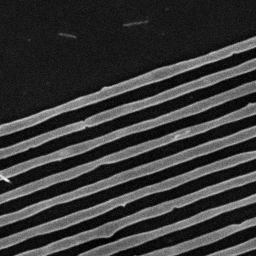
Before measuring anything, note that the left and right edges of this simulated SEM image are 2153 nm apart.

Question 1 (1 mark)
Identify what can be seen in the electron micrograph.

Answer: parallel lines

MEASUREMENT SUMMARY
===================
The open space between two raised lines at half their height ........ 107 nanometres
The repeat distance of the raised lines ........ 179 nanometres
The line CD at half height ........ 74.4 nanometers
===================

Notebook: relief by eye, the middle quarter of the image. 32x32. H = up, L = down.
LLLLLLLLLLLLLLLLLLLLLLLLLLHHHHHH
LLLLLLLLLLLLLLLLLLLLLLLHHHHHHHHL
LLLLLLLLLLLLLLLLLLLLHHHHHHHHLLLL
LLLLLLLLLLLLLLLLLLHHHHHHHHLLLLLL
LLLLLLLLLLLLLLLHHHHHHHLLLLLLLLLL
LLLLLLLLLLLLHHHHHHHLLLLLLLLLLHHH
LLLLLLLLLHHHHHHHHLLLLLLLLLHHHHHH
LLLLLLHHHHHHHHLLLLLLLLLLHHHHHHLL
LLLLHHHHHHHLLLLLLLLLLHHHHHHLLLLL
LLHHHHHHLLLLLLLLLLHHHHHHLLLLLLLL
HHHHHLLLLLLLLLHHHHHHHHLLLLLLLLLH
HHLLLLLLLLLHHHHHHHHLLLLLLLLLHHHH
LLLLLLLLLHHHHHHLLLLLLLLLLLHHHHHH
LLLLLLHHHHHHHLLLLLLLLLLHHHHHHLLL
LLLLHHHHHLLLLLLLLLLLHHHHHHLLLLLL
LHHHHHHLLLLLLLLLHHHHHHHHLLLLLLLL
HHHHLLLLLLLLLHHHHHHHLLLLLLLLLHHH
HLLLLLLLLLLHHHHHLLLLLLLLLLLHHHHH
LLLLLLLLHHHHHHLLLLLLLLLLHHHHHHLL
LLLLLHHHHHHLLLLLLLLLHHHHHHHLLLLL
LHHHHHHHHLLLLLLLLLHHHHHHLLLLLLLL
HHHHHHLLLLLLLLLHHHHHHLLLLLLLLLLH
HHHHLLLLLLLLHHHHHHHLLLLLLLLLHHHH
LLLLLLLLLLHHHHHHLLLLLLLLLHHHHHHH
LLLLLLLHHHHHHLLLLLLLLLHHHHHHHHLL
LLLHHHHHHLLLLLLLLLLHHHHHHHHLLLLL
LHHHHHHLLLLLLLLLHHHHHHHHLLLLLLLL
HHHHLLLLLLLLLHHHHHHHHLLLLLLLLLHH
HHLLLLLLLLLHHHHHHHLLLLLLLLLHHHHH
LLLLLLLLHHHHHHHLLLLLLLLLHHHHHHHL
LLLLLHHHHHHHLLLLLLLLLLHHHHHHLLLL
LLLHHHHHHLLLLLLLLLHHHHHHHLLLLLLL